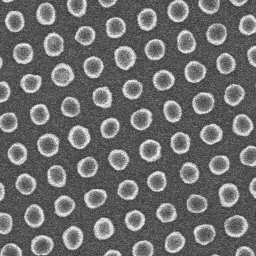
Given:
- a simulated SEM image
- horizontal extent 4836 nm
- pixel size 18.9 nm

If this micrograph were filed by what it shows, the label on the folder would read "a regular array of raised bodies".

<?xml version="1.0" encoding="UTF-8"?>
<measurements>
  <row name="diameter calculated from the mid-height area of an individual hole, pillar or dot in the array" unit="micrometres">0.356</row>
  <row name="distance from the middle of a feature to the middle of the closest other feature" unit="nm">592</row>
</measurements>